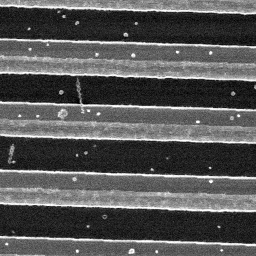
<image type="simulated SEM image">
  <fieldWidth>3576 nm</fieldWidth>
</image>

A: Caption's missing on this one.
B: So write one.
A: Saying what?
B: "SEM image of lines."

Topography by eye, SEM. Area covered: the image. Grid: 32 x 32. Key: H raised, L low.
HHHHHHHHHHHHHHHHHHHHHHHHHHHHHHHH
LLLLLLLLLLLLLLLLLLLLLLLLLLLLLHHH
LLLLLLLLLLLLLLLLLLLLLLLLLLLLLLLL
LLLLLLLLLLLLLLLLLLLLLLLLLLLLLLLL
LLLLLLLLLLLLLLLLLLLLLLLLLLLLLLLL
HHHHHHHHHHHHHHHHHHLLLLLLLLLLLLLL
HHHHHHHHHHHHHHHHHHHHHHHHHHHHHHHH
HHHHHHHHHHHHHHHHHHHHHHHHHHHHHHHH
HHHHHHHHHHHHHHHHHHHHHHHHHHHHHHHH
LLLLLLLLLLLLLLLHHHHHHHHHHHHHHHHH
LLLLLLLLLLLLLLLLLLLLLLLLLLLLLLLL
LLLLLLLLLLLLLLLLLLLLLLLLLLLLLLLL
LLLLLLLLLLLLLLLLLLLLLLLLLLLLLLLL
HHHHHHHHHHHHHHHHHHHHHHLLLLLLLLLL
HHHHHHHHHHHHHHHHHHHHHHHHHHHHHHHH
HHHHHHHHHHHHHHHHHHHHHHHHHHHHHHHH
HHHHHHHHHHHHHHHHHHHHHHHHHHHHHHHH
LLLLLLLLLLLLLLLLLLLLLLHHHHHHHHHH
LLLLLLLLLLLLLLLLLLLLLLLLLLLLLLLL
LLLLLLLLLLLLLLLLLLLLLLLLLLLLLLLL
LLLLLLLLLLLLLLLLLLLLLLLLLLLLLLLL
HHHHLLLLLLLLLLLLLLLLLLLLLLLLLLLL
HHHHHHHHHHHHHHHHHHHHHHHHHHHHHHHH
HHHHHHHHHHHHHHHHHHHHHHHHHHHHHHHH
HHHHHHHHHHHHHHHHHHHHHHHHHHHHHHHH
LLLHHHHHHHHHHHHHHHHHHHHHHHHHHHHH
LLLLLLLLLLLLLLLLLLLLLLLLLLLLLLLL
LLLLLLLLLLLLLLLLLLLLLLLLLLLLLLLL
LLLLLLLLLLLLLLLLLLLLLLLLLLLLLLLL
LLLLLLLLLLLLLLLLLLLLLLLLLLLLLLLL
HHHHHHHHHHHHHHHHHHHHHHHHHHHHHLLL
HHHHHHHHHHHHHHHHHHHHHHHHHHHHHHHH